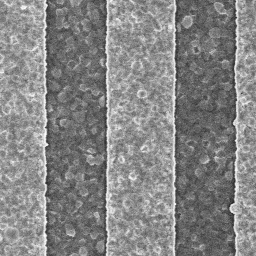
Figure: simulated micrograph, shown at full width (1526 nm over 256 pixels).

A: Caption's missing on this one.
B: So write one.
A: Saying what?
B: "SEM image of one or a few lines or trenches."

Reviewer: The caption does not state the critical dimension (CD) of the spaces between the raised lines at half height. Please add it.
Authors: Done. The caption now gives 367 nanometres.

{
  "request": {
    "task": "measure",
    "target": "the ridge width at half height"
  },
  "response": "395 nm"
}